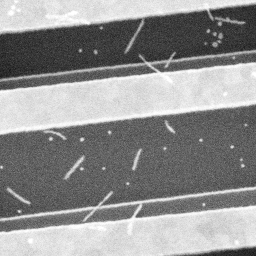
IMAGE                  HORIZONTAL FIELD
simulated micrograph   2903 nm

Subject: lines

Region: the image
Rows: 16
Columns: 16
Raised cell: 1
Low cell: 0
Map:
1111111111111000
1111000000000000
0000000000000000
0000000000000000
0000000000011111
0111111111111111
1111111111111110
1111110000000000
0000000000000000
0000000000000000
0000000000000000
0000000000000000
0000000000000000
0000000000111111
0111111111111111
1111111111111100